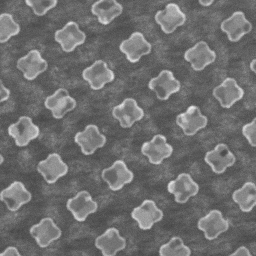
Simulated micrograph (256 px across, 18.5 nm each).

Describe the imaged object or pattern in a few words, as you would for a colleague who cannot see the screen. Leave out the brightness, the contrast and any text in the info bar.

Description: a regular array of raised bodies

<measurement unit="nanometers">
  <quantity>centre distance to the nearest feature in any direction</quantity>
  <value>850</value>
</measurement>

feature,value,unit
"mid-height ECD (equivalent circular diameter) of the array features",480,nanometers